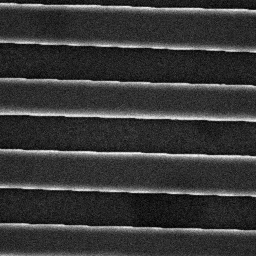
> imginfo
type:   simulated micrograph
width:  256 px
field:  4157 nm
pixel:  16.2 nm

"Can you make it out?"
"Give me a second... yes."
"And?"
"lines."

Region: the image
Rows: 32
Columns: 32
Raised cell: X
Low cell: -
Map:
X-------------------------------
XXXXXXXXXXXXXXXXXXXXXXXXXXXXXXXX
XXXXXXXXXXXXXXXXXXXXXXXXXXXXXXXX
XXXXXXXXXXXXXXXXXXXXXXXXXXXXXXXX
XXXXXXXXXXXXXXXXXXXXXXXXXXXXXXXX
-----XXXXXXXXXXXXXXXXXXXXXXXXXXX
--------------------------------
--------------------------------
--------------------------------
--------------------------------
XXXXXXXXXXXXXXXXXXXXXXXX--------
XXXXXXXXXXXXXXXXXXXXXXXXXXXXXXXX
XXXXXXXXXXXXXXXXXXXXXXXXXXXXXXXX
XXXXXXXXXXXXXXXXXXXXXXXXXXXXXXXX
-----------XXXXXXXXXXXXXXXXXXXXX
--------------------------------
--------------------------------
--------------------------------
--------------------------------
XXXXXXXXXXXXXXXXXXXXXXXXXXXX----
XXXXXXXXXXXXXXXXXXXXXXXXXXXXXXXX
XXXXXXXXXXXXXXXXXXXXXXXXXXXXXXXX
XXXXXXXXXXXXXXXXXXXXXXXXXXXXXXXX
---XXXXXXXXXXXXXXXXXXXXXXXXXXXXX
--------------------------------
--------------------------------
--------------------------------
--------------------------------
XXXXXXXXXXXXXXXXXXXX------------
XXXXXXXXXXXXXXXXXXXXXXXXXXXXXXXX
XXXXXXXXXXXXXXXXXXXXXXXXXXXXXXXX
XXXXXXXXXXXXXXXXXXXXXXXXXXXXXXXX